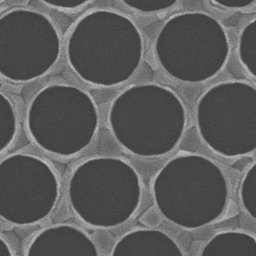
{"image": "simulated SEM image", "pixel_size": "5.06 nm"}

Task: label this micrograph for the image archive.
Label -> holes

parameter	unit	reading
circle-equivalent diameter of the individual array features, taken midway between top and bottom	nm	356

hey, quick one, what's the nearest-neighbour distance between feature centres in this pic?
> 422 nm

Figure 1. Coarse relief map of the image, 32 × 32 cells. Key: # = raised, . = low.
#######...######......######...#
##..########..##################
......####......#####......#####
.......###.......###........###.
.......##........###........##..
.......##.........##........##..
.......##.........##........##..
.......##........###........##..
......###........####......####.
#....#####......######....######
#############.##############..##
#####.....######.....#####......
.###.......####.......###.......
.###........##.........##.......
..##........##.........##.......
..##........##.........##.......
..##........##.........##.......
.####......####.......####......
######....######......#####.....
##.#####################.#######
......#####.....#####......#####
......###........###........###.
.......##........###........###.
.......##........##.........##..
.......##........###........##..
.......##........###........###.
......####......####........###.
#....######.....#####......#####
#######..#######################
#####......#####.....######....#
.###........###.......####......
.###........##.........##.......